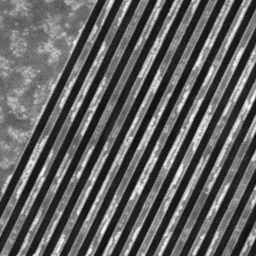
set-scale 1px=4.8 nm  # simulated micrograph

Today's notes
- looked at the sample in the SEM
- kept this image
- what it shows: parallel lines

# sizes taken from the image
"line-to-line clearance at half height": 7.98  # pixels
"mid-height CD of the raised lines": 0.0334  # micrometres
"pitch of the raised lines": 0.0737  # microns